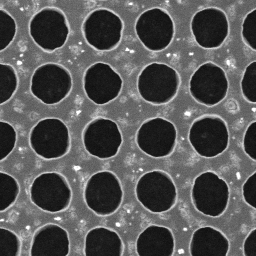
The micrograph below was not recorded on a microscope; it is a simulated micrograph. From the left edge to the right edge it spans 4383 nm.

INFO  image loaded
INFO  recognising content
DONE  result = a regular array of holes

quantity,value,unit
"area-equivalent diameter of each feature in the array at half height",38.5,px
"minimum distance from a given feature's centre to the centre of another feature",0.896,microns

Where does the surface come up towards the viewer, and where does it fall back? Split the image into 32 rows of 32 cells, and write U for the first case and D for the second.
UUUUUUUUUUUUUUUUUUUUUUUUUUUUUUUU
UUUUUDDUUUUUDDUUUUDDUUUUUDDDUUUD
DDUUDDDDUUUDDDDUUDDDDUUUDDDDUUUD
DDUUDDDDUUUDDDDUUDDDDDUUDDDDUUDD
DDUUDDDDUUUDDDDUUDDDDUUUDDDDUUDD
DUUUUDDDUUUDDDUUUUDDDUUUUDDUUUUD
UUUUUUUUUUUUUUUUUUUUUUUUUUUUUUUU
UUUUUUUUUUUUUUUUUUUUUUUUUUUUUUUU
DUUUUDDUUUUDDDUUUUDDDUUUUDDUUUUD
DDUUDDDDDUUDDDDUUUDDDDUUDDDDUUDD
DDUUDDDDDUUDDDDUUDDDDDUUDDDDUUDD
DDUUDDDDUUUDDDDUUDDDDDUUDDDDUUDD
DUUUUDDDUUUDDDUUUUDDDUUUUDDDUUUD
UUUUUUUUUUUUUUUUUUUUUUUUUUUUUUUU
UUUUUUUUUUUUUUUUUUUUUUUUUUUUUUUU
DUUUUDDDUUUDDDUUUUDDDUUUDDDDUUUU
DDUUDDDDUUUDDDDUUDDDDDUUDDDDUUUD
DDUUDDDDDUDDDDDUUDDDDDUUDDDDUUDD
DDUUDDDDUUUDDDDUUUDDDUUUDDDDUUUD
DUUUUDDDUUUUDDUUUUUDUUUUUDDUUUUD
UUUUUUUUUUUUUUUUUUUUUUUUUUUUUUUU
UUUUUUUUUUUUUUUUUUUDUUUUUUUUUUUU
DDUUDDDDUUUDDDDUUUDDDUUUDDDDUUUD
DDUUDDDDUUUDDDDUUDDDDDUUDDDDUUDD
DDUUDDDDDUUDDDDUUDDDDDUUDDDDDUUD
DUUUDDDDUUUDDDDUUUDDDDUUDDDDUUUD
UUUUUUUUUUUUDDUUUUUDUUUUUDDDUUUU
UUUUUUUUUUUUUUUUUUUUUUUUUUUUUUUU
UUUUUUDDUUUUDUUUUUDDDUUUUDUUUUUU
DDUUUDDDUUUDDDDUUDDDDUUUDDDDUUUD
DDUUDDDDDUUDDDDUUDDDDDUUDDDDDUUD
DDUUDDDDDUUDDDDUUDDDDDUUDDDDUUUD